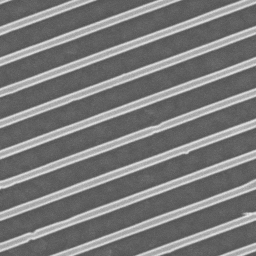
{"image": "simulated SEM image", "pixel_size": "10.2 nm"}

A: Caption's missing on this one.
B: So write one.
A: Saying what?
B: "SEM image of parallel lines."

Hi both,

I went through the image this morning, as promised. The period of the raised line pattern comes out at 0.297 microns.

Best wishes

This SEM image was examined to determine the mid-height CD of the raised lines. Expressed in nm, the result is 68.5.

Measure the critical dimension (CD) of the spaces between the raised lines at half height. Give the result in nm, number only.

225